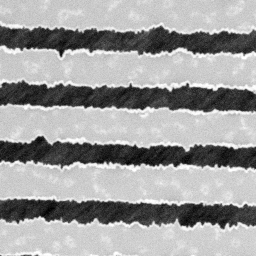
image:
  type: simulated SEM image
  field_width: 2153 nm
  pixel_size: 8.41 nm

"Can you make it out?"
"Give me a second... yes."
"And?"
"parallel lines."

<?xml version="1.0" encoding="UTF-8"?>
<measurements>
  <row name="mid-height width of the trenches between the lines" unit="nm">185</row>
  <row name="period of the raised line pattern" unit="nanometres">482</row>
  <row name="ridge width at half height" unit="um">0.29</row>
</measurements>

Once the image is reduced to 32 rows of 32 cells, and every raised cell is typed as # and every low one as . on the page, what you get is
################################
################################
################################
...#..#.###.#######..###########
................................
................................
#######.######..#....###........
################################
################################
################################
....###.########################
................................
................................
###########.....................
################################
################################
################################
.###..##########################
.......................#........
................................
#####....###.#..................
################################
################################
################################
################################
.....................##...#.####
................................
...###..........................
################################
################################
################################
################################